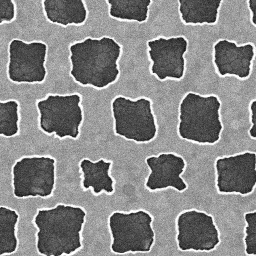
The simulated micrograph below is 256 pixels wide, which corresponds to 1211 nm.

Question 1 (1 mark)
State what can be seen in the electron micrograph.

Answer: a regular array of holes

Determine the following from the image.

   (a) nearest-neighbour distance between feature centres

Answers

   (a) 300 nanometers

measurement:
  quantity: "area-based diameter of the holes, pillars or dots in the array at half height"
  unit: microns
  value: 0.207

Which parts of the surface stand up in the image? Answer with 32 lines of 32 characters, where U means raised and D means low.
DDUUUDDDDDUUUUDDDDDUUUDDDDDDUUUD
DDUUUUDDDDDUUUDDDDUUUUDDDDDUUUUD
DUUUUUDDDDDUUUUUDDUUUUUDDDDUUUUU
UUUUUUUUUUUUUUUUUUUUUUUUUUUUUUUU
UUUUUUUUUUUUUUUUUUUUUUUUUUUUUUUU
UDDDDUUUUDDDDDDUUUUDDDDUUUUDDDUU
UDDDDDUUUDDDDDDUUUUDDDDUUUUDDDDD
UDDDDDUUUDDDDDDUUUUDDDDUUUUDDDDD
UDDDDDUUUDDDDDDUUUUDDDDUUUUDDDDU
UDDDDDUUUDDDDDDUUUUDDDDUUUUUUDDU
UUUUUUUUUUDDDDUUUUUUUUUUUUUUUUUU
UUUUUUUUUUUUUUUUUUUUUUUUUUUUUUUU
UUUUUDDDDDUUUUDDDDDUUUUDDDDUUUUU
DDUUUDDDDDUUUUDDDDDUUUUDDDDDUUUD
DDUUUDDDDDUUUUDDDDDUUUDDDDDUUUUD
DDUUUDDDDDUUUUDDDDDUUUDDDDDDUUUD
DDUUUUDDDDUUUUUDDDDDUUDDDDDDUUUD
UUUUUUUUUUUUUUUUDDDUUUUUDDDUUUUU
UUUUUUUUUUUUUUUUUUUUUUUUUUUUUUUU
UUUUUUUUUUUUUUUUUUUUDDUUUUUUUDDD
UUDDDDDUUUDDDDUUUUDDDDDUUUUDDDDD
UUDDDDDUUUDDDDUUUUUDDDDUUUUDDDDD
UUDDDDDUUUDDDDUUUUDDDDDUUUUDDDDD
UUDDDDDUUUUDDDUUUUUDDUDUUUUDDDDD
UUDDUDUUUUUUUUUUUUUUUUUUUUUUUUUU
UUUUUUUUUUUUUUUUUUUUUUUUUUUUUUUU
DDUUUDDDDDDUUUUUUDUUUUUDDUUUUUUU
DDUUDDDDDDDUUUDDDDDUUUDDDDDUUUUD
DDUUUDDDDDUUUUDDDDDUUUDDDDDUUUUD
DDUUUDDDDDUUUUDDDDDUUUDDDDDUUUUD
DDUUUDDDDDUUUUDDDDDUUUDDDDDUUUUD
DDUUUDDDDUUUUUDDDDUUUUUUUUUUUUUD